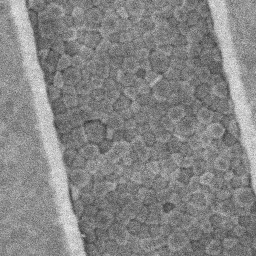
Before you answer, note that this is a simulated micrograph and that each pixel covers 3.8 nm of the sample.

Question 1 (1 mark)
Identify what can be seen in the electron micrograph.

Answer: one or a few lines or trenches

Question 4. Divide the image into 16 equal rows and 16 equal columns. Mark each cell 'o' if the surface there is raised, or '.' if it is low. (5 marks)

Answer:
o.............oo
oo............oo
oo............oo
oo............oo
oo.............o
oo.............o
ooo............o
ooo............o
ooo............o
ooo.............
oooo............
oooo............
oooo............
oooo............
ooooo...........
ooooo...........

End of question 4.